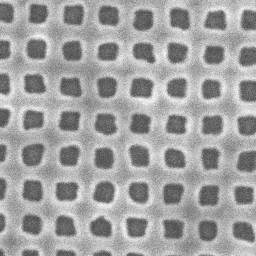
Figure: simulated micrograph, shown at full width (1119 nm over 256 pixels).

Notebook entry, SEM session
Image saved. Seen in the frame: a regular array of holes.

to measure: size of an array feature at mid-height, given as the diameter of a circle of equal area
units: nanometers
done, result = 98.9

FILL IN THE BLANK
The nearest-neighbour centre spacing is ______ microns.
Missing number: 0.149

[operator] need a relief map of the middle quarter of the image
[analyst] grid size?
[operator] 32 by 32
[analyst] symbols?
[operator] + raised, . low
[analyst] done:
++++++++++++++++++++++++++++++++
++++++++++++++++++++++++++++++++
++++++++++++++++++++++++++++++++
.+..+++++....+++++...+++++++..++
....++++......+++.....++++.....+
....++++.....+++.......+++.....+
.....+++.....+++......++++.....+
.....++++....+++......++++.....+
++..++++++.+++++++...++++++...++
++++++++++++++++++++++++++++++++
++++++++++++++++++++++++++++++++
++++++++++++++++++++++++++++++++
....++++....+++++...++++++++++++
....++++.....++++.....++++.....+
....++++.....++++.....++++.....+
....+++......+++......+++......+
....++++.....+++......+++......+
+++++++++....+++++..+++++++...++
++++++++++++++++++++++++++++++++
++++++++++++++++++++++++++++++++
+...+++++++++++++....+++++++++++
....++++....++++......+++.....++
....+++......+++......+++.....++
....+++......++++.....+++.....++
....+++......++++.....+++.....++
...+++++....+++++....++++.....++
++++++++++++++++++++++++++++++++
++++++++++++++++++++++++++++++++
++++++++++++++++++++++++++++++++
...+++++....+++++..+++++++++++++
....++++.....+++.....++++.....++
....++++.....+++.....++++.....++